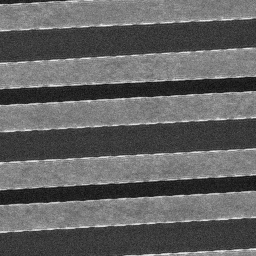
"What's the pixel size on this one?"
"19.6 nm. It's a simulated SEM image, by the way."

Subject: lines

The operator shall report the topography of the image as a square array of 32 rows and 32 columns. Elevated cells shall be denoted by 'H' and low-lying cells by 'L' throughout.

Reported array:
LHHHHHHHHHHHHHHHHHHHHHHHHHHHHHHH
HHHHHHHHHHHHHHHHHHHHHHHHHHHHHHHH
HHHHHHHHHHHHHHHHHHHHHHHHHHLLLLLL
HHHHHHLLLLLLLLLLLLLLLLLLLLLLLLLL
LLLLLLLLLLLLLLLLLLLLLLLLLLLLLLLL
LLLLLLLLLLLLLLLLLLLLLLLLLLLLLLLL
LLLLLLLLLLLLLLLLLLLLLLLLHHHHHHHH
LLLLLLLLHHHHHHHHHHHHHHHHHHHHHHHH
HHHHHHHHHHHHHHHHHHHHHHHHHHHHHHHH
HHHHHHHHHHHHHHHHHHHHHHHHHHHHHHHH
HHHHHHHHHHLLLLLLLLLLLLLLLLLLLLLL
LLLLLLLLLLLLLLLLLLLLLLLLLLLLLLHH
LLLLLLLLLLLLHHHHHHHHHHHHHHHHHHHH
HHHHHHHHHHHHHHHHHHHHHHHHHHHHHHHH
HHHHHHHHHHHHHHHHHHHHHHHHHHHHHHHH
HHHHHHHHHHHHHHHHHLLLLLLLLLLLLLLL
LLLLLLLLLLLLLLLLLLLLLLLLLLLLLLLL
LLLLLLLLLLLLLLLLLLLLLLLLLLLLLLLL
LLLLLLLLLLLLLLLLLLLLLLLLLLLLLLLL
LLLLLLLLLLLLLLLLLHHHHHHHHHHHHHHH
HHHHHHHHHHHHHHHHHHHHHHHHHHHHHHHH
HHHHHHHHHHHHHHHHHHHHHHHHHHHHHHHH
HHHHHHHHHHHHHHHHHHHHLLLLLLLLLLLL
HHHLLLLLLLLLLLLLLLLLLLLLLLLLLLLL
LLLLLLLLLLLLLLLLLLLLLHHHHHHHHHHH
LLLLHHHHHHHHHHHHHHHHHHHHHHHHHHHH
HHHHHHHHHHHHHHHHHHHHHHHHHHHHHHHH
HHHHHHHHHHHHHHHHHHHHHHHHHHLLLLLL
HHHHHHHHHHLLLLLLLLLLLLLLLLLLLLLL
LLLLLLLLLLLLLLLLLLLLLLLLLLLLLLLL
LLLLLLLLLLLLLLLLLLLLLLLLLLLLLLLL
LLLLLLLLLLLLLLLLLLLLLLLLHHHHHHHH